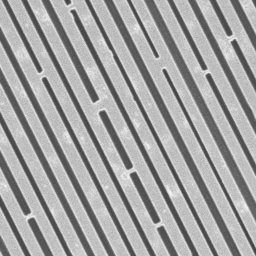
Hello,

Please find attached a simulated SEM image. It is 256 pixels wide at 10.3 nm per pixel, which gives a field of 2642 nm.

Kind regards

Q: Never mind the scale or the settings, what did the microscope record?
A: parallel lines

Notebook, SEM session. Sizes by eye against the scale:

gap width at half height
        0.0599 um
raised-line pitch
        18.6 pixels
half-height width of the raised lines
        0.138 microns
